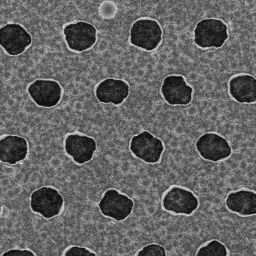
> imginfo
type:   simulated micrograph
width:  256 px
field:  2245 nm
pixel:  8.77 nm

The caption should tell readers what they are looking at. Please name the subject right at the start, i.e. a regular array of holes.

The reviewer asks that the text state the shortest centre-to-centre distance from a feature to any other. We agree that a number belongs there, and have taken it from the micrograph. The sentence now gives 0.563 µm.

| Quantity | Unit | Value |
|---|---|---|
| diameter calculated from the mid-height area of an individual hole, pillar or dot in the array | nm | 269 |